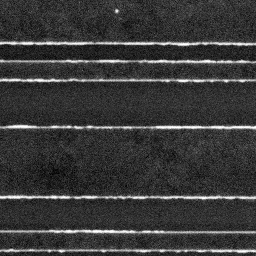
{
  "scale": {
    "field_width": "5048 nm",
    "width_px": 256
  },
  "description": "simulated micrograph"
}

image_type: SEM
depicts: lines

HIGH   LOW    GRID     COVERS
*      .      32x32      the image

********************************
********************************
********************************
********************************
********************************
....................*****...****
................................
................................
********************************
********************************
................................
................................
................................
................................
................................
................................
********************************
********************************
********************************
********************************
********************************
********************************
********************************
********************************
********************************
................................
................................
................................
................................
********************************
********************************
................................